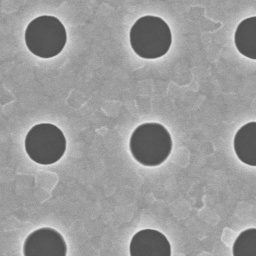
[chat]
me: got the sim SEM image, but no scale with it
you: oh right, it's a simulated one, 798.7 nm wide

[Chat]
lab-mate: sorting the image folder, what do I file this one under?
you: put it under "holes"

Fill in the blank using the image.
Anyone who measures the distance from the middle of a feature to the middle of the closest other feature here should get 328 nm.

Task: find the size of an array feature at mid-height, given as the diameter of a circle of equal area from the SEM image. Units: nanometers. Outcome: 131